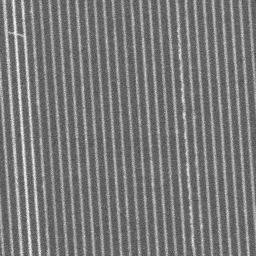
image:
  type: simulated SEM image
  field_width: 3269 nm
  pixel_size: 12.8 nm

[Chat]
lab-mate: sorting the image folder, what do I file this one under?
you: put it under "parallel lines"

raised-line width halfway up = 17.5 nm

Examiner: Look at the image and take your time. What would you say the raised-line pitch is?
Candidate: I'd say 0.116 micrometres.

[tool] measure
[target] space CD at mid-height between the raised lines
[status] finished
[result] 0.0955 microns